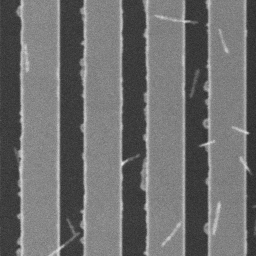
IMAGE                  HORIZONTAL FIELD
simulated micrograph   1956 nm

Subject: lines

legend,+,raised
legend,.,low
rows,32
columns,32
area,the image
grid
...++++....++++...+++++...+++++.
...++++....++++...+++++...+++++.
...++++....++++...+++++...+++++.
...++++....++++...+++++...+++++.
...++++....++++...+++++...+++++.
...++++....++++...+++++...+++++.
...++++....++++...+++++...+++++.
...++++....++++...+++++...+++++.
...++++....++++...+++++...+++++.
...++++....++++...+++++...+++++.
...++++....++++...+++++...+++++.
...++++...+++++...+++++...+++++.
...++++....++++...+++++...+++++.
...++++....++++...+++++...+++++.
...++++....++++...+++++...+++++.
...++++....++++...+++++...+++++.
...++++....++++...+++++...+++++.
...++++....++++...+++++...+++++.
...++++....++++...+++++...+++++.
...++++....++++...+++++...+++++.
...++++....++++...+++++...+++++.
..+++++....++++...+++++...+++++.
...++++....++++...+++++...+++++.
...++++....++++...+++++...+++++.
...++++....++++...+++++...+++++.
...++++....++++...+++++...+++++.
...++++...+++++...+++++...+++++.
...++++...+++++...+++++...+++++.
...++++....++++...+++++...+++++.
...++++....++++...+++++...+++++.
...+++++...++++...+++++...+++++.
...+++++...++++...+++++...+++++.